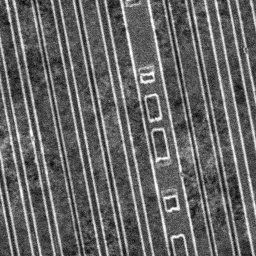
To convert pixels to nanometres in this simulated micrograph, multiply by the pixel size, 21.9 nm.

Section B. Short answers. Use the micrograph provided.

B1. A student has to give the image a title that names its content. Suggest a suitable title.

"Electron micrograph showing parallel lines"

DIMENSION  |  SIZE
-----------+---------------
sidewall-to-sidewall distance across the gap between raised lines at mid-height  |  159 nm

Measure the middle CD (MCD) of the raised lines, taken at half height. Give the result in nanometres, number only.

336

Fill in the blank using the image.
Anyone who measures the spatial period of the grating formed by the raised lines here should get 476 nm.